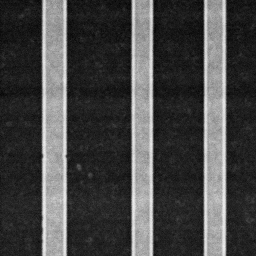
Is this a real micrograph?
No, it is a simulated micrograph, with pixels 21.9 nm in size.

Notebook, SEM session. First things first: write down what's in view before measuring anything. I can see one or a few lines or trenches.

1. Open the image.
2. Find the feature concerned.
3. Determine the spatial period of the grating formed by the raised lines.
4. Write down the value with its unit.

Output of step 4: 1760 nm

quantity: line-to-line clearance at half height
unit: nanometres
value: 1350